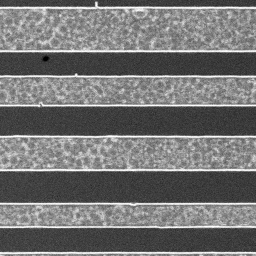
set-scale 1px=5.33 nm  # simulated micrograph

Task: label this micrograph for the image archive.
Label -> one or a few lines or trenches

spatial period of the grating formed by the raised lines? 330 nm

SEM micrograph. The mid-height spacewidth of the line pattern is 27.8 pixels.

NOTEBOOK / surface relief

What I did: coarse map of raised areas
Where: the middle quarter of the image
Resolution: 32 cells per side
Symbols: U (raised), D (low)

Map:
DDDDDDDDDDDDDDDDDDDDDDDDDDDDDDDD
DDDDDDDDDDDDDDDDDDDDDDDDDDDDDDDD
DDDDDDDDDDDDDDDDDDDDDDDDDDDDDDDD
UUUUUUUUUUUUUUUUUUUUUUUUUUUUUUUU
UUUUUUUUUUUUUUUUUUUUUUUUUUUUUUUU
UUUUUUUUUUUUUUUUUUUUUUUUUUUUUUUU
UUUUUUUUUUUUUUUUUUUUUUUUUUUUUUUU
UUUUUUUUUUUUUUUUUUUUUUUUUUUUUUUU
UUUUUUUUUUUUUUUUUUUUUUUUUUUUUUUU
UUUUUUUUUUUUUUUUUUUUUUUUUUUUUUUU
DDDDDDDDDDDDDDDDDDDDDDDDDDDDDDDD
DDDDDDDDDDDDDDDDDDDDDDDDDDDDDDDD
DDDDDDDDDDDDDDDDDDDDDDDDDDDDDDDD
DDDDDDDDDDDDDDDDDDDDDDDDDDDDDDDD
DDDDDDDDDDDDDDDDDDDDDDDDDDDDDDDD
DDDDDDDDDDDDDDDDDDDDDDDDDDDDDDDD
DDDDDDDDDDDDDDDDDDDDDDDDDDDDDDDD
DDDDDDDDDDDDDDDDDDDDDDDDDDDDDDDD
UUUUUUUUUUUUUUUUUUUUUUUUUUUUUUUU
UUUUUUUUUUUUUUUUUUUUUUUUUUUUUUUU
UUUUUUUUUUUUUUUUUUUUUUUUUUUUUUUU
UUUUUUUUUUUUUUUUUUUUUUUUUUUUUUUU
DUUUUUDUUUUUUUUUUUUUUUUUUUUUUUUU
DUUUUUUUUUUUUUUUUUUUUUUUUUUUUUUU
UUUUUUUUUUUUUUUUUUUUUUUUUUUUUUUU
UUUUUUUUUUUUUUUUUUUUUUUUUUUUUUUU
DDDDDDDDDDDDDDDDDDDDDDDDDDDDDDDD
DDDDDDDDDDDDDDDDDDDDDDDDDDDDDDDD
DDDDDDDDDDDDDDDDDDDDDDDDDDDDDDDD
DDDDDDDDDDDDDDDDDDDDDDDDDDDDDDDD
DDDDDDDDDDDDDDDDDDDDDDDDDDDDDDDD
DDDDDDDDDDDDDDDDDDDDDDDDDDDDDDDD